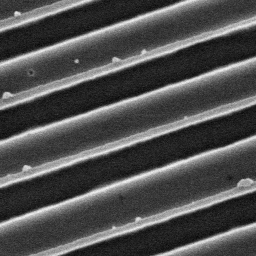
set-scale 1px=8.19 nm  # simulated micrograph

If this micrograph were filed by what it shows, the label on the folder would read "lines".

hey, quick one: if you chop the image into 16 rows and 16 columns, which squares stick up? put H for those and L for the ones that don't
HHHHLLLLLLHHHHHH
HLLLLLLHHHHHHHHH
LLLLHHHHHHHHHLLL
LLHHHHHHHHLLLLLL
HHHHHHHLLLLLLHHH
HHHHLLLLLLHHHHHH
HLLLLLLHHHHHHHHH
LLLLHHHHHHHHHLLL
LHHHHHHHHHLLLLLL
HHHHHHLLLLLLLHHH
HHHLLLLLLLHHHHHH
LLLLLLLHHHHHHHHH
LLLLHHHHHHHHHHLL
LHHHHHHHHHHLLLLL
HHHHHHHHLLLLLLHH
HHHHHLLLLLLHHHHH